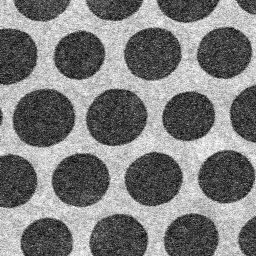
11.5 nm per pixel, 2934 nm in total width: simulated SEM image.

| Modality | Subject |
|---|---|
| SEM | a regular array of holes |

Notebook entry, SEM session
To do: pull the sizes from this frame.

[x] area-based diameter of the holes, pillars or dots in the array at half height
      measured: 648 nanometres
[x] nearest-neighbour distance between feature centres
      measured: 0.827 µm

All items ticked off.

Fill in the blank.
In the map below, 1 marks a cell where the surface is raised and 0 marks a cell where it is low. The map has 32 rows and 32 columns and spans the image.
11000000011000000011000000011100
11000000111000000111000000011110
11110001111110001111100001111111
10111111111111111100111111100111
00001111000011110000001110000001
00001110000001110000000110000001
00000110000001100000000110000000
00000110000001110000000110000001
00001110000001110000001110000001
00001111000011111000011111000011
00111111111111111111111111111111
11110000111110000111111001111100
11000000011100000011100000111000
11000000011000000011000000011000
11000000011000000011000000011000
11000000011000000011000000011000
11000000011000000011100000111000
11100000111100000111110001111110
11111111111111111111111111111111
00011111000011111100011111000001
00001110000001110000001110000000
00000110000000110000000110000000
00000100000000100000000110000000
00000110000000110000000110000000
00001110000001110000001111000001
00011111000011111000011111111111
11111111111111111111111111111111
11110001111100000111110000111110
11100000011100000011100000011100
11100000011000000011000000011100
11000000011000000001000000011100
11100000011000000011100000011100